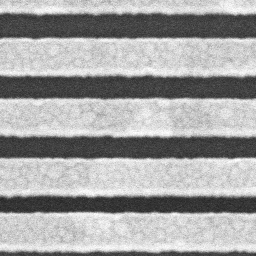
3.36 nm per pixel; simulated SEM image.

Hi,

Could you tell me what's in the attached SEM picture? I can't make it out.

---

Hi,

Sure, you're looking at lines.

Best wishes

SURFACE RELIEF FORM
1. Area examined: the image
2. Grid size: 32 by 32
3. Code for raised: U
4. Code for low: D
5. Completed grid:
UUUUUUUUUUUUUUUUUUUUUUUUUUUUUUUU
UUUUUUUUUUUUUUUUUUUUUUUUUUUUUUUU
DDDDDDDDDDDDDDDDDDDDDDDDDDDDDDDD
DDDDDDDDDDDDDDDDDDDDDDDDDDDDDDDD
DDDDDDDDDDDDDDDDDDDDDDDDDDDDDDDD
UUUUUUUUUUUUUUUUUUUUUUUUUUUUUUUU
UUUUUUUUUUUUUUUUUUUUUUUUUUUUUUUU
UUUUUUUUUUUUUUUUUUUUUUUUUUUUUUUU
UUUUUUUUUUUUUUUUUUUUUUUUUUUUUUUU
DUUDUUDUUDUDDDDDUDDUUUUDUUUDDUUD
DDDDDDDDDDDDDDDDDDDDDDDDDDDDDDDD
DDDDDDDDDDDDDDDDDDDDDDDDDDDDDDDD
UUUUUUUUUUUUUUUUUUUUUUUUUUUUUUDU
UUUUUUUUUUUUUUUUUUUUUUUUUUUUUUUU
UUUUUUUUUUUUUUUUUUUUUUUUUUUUUUUU
UUUUUUUUUUUUUUUUUUUUUUUUUUUUUUUU
UUUUUUUUUUUUUUUUUUUUUUUUUUUUUUUU
DDDDDDDDDDDDDDDDDDDDDDDDDDDDDDDD
DDDDDDDDDDDDDDDDDDDDDDDDDDDDDDDD
DDDDDDDDDDDDDDDDDDDDDDDDDDDDDDDD
UUUUUUUUUUUUUUUUUUUUUUUUUUUUUUUU
UUUUUUUUUUUUUUUUUUUUUUUUUUUUUUUU
UUUUUUUUUUUUUUUUUUUUUUUUUUUUUUUU
UUUUUUUUUUUUUUUUUUUUUUUUUUUUUUUU
UUUUDDDDUUUUDUUUUUUUUDDUUDUUUUUU
DDDDDDDDDDDDDDDDDDDDDDDDDDDDDDDD
DDDDDDDDDDDDDDDDDDDDDDDDDDDDDDDD
UUUUUUUUUUUUUUUUUUUUUUUUUUUUUUUU
UUUUUUUUUUUUUUUUUUUUUUUUUUUUUUUU
UUUUUUUUUUUUUUUUUUUUUUUUUUUUUUUU
UUUUUUUUUUUUUUUUUUUUUUUUUUUUUUUU
DDDDDDDDDDUDDDDDDDDUDDDDDDDDDDDD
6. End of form